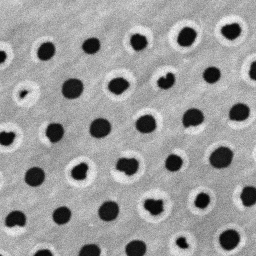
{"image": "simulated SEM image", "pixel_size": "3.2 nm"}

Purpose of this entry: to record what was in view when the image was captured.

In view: a regular array of holes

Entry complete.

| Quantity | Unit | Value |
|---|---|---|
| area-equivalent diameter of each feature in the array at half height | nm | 59.9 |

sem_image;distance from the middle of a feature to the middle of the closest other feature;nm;146